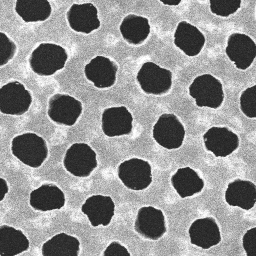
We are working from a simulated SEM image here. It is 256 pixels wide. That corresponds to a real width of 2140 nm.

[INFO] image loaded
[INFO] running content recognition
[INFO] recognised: a regular array of holes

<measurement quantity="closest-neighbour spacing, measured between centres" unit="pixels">51.9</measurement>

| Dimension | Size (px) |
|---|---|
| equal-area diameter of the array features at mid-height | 31.5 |